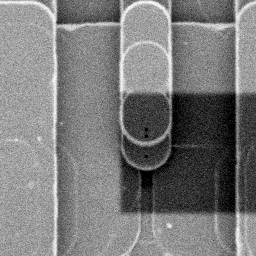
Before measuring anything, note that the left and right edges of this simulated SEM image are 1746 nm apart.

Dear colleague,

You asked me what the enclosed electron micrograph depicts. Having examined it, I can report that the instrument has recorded wiring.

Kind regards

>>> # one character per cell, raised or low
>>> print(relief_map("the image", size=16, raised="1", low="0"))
1110000011000001
1110000011100001
1110000011100001
1110000011100001
1110000011100001
1110000011100001
1110000011100001
1110000011100001
1110000011100001
1110000011100001
1110000001000001
1110000000000001
1110000000000001
1110000000000001
1110000000000001
1110000000000001